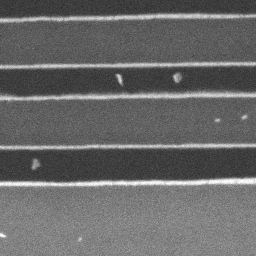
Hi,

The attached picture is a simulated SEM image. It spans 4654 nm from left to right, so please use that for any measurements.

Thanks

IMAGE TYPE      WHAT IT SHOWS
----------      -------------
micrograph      lines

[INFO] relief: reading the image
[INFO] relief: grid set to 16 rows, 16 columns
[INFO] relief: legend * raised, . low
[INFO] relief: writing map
****************
................
................
................
****************
****************
................
................
................
****************
****************
*********.......
................
................
................
................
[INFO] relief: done